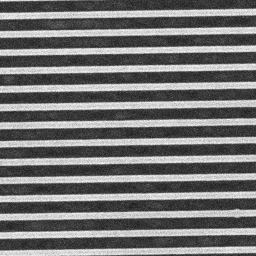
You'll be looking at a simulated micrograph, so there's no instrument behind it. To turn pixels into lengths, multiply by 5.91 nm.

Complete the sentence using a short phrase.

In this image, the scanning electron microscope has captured parallel lines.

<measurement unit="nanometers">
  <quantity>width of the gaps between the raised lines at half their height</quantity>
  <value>71.6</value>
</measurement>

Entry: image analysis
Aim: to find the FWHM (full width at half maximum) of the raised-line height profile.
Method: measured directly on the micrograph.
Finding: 6.01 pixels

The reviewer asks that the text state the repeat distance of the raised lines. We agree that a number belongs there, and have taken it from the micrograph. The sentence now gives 108 nanometers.